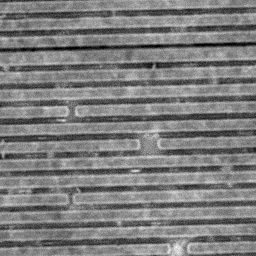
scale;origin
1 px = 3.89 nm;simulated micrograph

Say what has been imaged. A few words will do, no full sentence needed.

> parallel lines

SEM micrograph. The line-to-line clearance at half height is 30.6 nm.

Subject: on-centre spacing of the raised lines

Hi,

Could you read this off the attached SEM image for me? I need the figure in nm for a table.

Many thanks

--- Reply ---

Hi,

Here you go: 68.1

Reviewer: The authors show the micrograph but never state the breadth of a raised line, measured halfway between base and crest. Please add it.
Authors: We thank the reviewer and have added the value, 9.74 px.